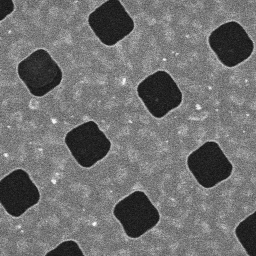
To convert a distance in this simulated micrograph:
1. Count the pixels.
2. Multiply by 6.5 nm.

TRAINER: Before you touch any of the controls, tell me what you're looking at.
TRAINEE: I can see holes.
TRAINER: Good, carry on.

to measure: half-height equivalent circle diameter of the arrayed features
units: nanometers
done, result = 276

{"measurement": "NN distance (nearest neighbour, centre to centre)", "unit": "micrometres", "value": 0.561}